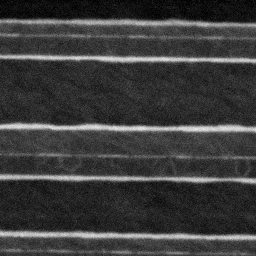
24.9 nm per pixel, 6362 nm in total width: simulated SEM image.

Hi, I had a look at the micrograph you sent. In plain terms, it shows lines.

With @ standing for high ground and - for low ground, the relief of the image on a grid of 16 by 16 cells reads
----------------
@@@@@@@@@@@@----
@@@@@@@@@@@@@@@@
-@@@@@@@@@@@@@@@
----------------
----------------
----------------
----------------
@@@@@@@@@@@@@@@@
@@@@@@@@@@@@@@@@
@@@@@@@@@@@@@@@@
----------------
----------------
----------------
----------------
@@@@@@@@@@@@@@@@